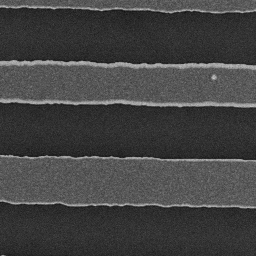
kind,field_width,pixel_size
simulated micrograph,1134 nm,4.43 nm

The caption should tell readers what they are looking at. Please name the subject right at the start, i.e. lines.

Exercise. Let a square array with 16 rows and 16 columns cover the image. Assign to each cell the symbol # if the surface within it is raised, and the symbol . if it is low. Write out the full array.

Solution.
...#############
................
................
................
################
################
.........#######
................
................
................
################
################
################
................
................
................